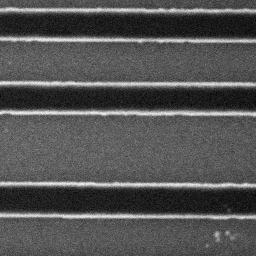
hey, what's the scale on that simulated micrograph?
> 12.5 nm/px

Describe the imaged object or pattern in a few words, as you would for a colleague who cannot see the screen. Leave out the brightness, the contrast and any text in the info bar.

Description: lines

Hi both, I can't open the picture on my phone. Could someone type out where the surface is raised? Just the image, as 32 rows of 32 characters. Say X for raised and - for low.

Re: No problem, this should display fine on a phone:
--------------------------------
XXXXXXXXXXXXXXXXXXXXXXXXXXXXXXXX
XXXXXXXXXXXXXXXXXXXXXXXXXXXXXXXX
XXXXXXXXXXXXXXXXXXXXXXXXXXXXXXXX
XXXXXXXXXXXXXXXXXXXXXXXXXXXXXXXX
--------------------------------
--------------------------------
--------------------------------
--------------------------------
--------------------------------
XXXXXXXXXXXXXXXXXXXX--X-X---XXX-
XXXXXXXXXXXXXXXXXXXXXXXXXXXXXXXX
XXXXXXXXXXXXXXXXXXXXXXXXXXXXXXXX
XXXXXXXXXXXXXXXXXXXXXXXXXXXXXXXX
--------------------------------
--------------------------------
--------------------------------
--------------------------------
--------------------------------
--------------------------------
--------------------------------
--------------------------------
--------------------------------
XXXXXXXXXXXXXXXXXXXXXXXXXXXXXXXX
XXXXXXXXXXXXXXXXXXXXXXXXXXXXXXXX
XXXXXXXXXXXXXXXXXXXXXXXXXXXXXXXX
XXXXXXXXXXXXXXXXXXXXXXXXXXXXXXXX
--------------------------------
--------------------------------
--------------------------------
--------------------------------
--------------------------------